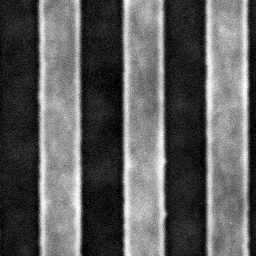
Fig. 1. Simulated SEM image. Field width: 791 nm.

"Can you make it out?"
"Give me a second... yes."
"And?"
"one or a few lines or trenches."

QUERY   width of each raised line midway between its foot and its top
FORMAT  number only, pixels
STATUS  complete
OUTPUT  37.6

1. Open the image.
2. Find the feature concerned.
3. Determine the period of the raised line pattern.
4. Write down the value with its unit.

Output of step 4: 0.258 um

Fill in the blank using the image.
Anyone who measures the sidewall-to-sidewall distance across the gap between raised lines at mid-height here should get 144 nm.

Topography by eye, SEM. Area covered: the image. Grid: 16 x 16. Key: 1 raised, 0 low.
0001100011000110
0001100011000110
0001100011000110
0001100011000110
0001100011000110
0001100011000110
0001100011000110
0001100011000110
0001100011000110
0001100011000110
0001100011000110
0001100011000110
0001100011000110
0001100011000110
0001100011000110
0001100011000110